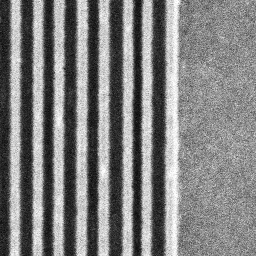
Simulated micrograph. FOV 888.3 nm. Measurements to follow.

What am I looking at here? parallel lines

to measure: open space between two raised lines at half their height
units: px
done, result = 11.6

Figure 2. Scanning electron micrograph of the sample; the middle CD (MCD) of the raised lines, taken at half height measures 37.3 nm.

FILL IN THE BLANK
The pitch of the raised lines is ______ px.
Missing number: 22.2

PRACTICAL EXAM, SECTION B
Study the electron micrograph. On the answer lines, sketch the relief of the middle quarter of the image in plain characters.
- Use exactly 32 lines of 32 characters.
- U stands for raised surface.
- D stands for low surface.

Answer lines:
DDDUUUDDDUUDDDDUUDDUUUDDDUUUDDDD
DDDUUUDDDUUDDDDUUDDUUUDDDUUUDDDD
DDDUUUDDDUUDDDDUUDDUUUDDDUUUDDDD
DDDUUUDDDUUDDDDUUDDDUUDDDUUUDDDD
DDDUUUDDDUUDDDDUUDDDUUDDDUUUDDDD
DDDUUUDDDUUDDDDUUDDUUUDDDUUUDDDD
DDDUUUDDDUUDDDDUUDDUUUDDDUUUDDDD
DDDUUUDDDUUDDDDUUDDUUUDDDUUUDDDD
DDDUUUDDUUUDDDDUUDDUUUDDDUUUDDDD
DDDUUUDDDUUDDDDUUDDUUUDDDUUUDDDD
DDDUUUDDDUUDDDDUUDDUUUDDDUUUDDDD
DDDUUUDDDUUDDDDUUDDDUUDDDUUUDDDD
DDDUUUDDDUUDDDDUUDDUUUDDDUUUDDDD
DDDUUUDDDUUDDDDUUDDUUUDDDUUUDDDD
DDDUUUDDDUUDDDDUUDDUUUDDDUUUDDDD
DDDUUUDDDUUDDDDUUDDUUUDDDUUUDDDD
DDDUUUDDDUUDDDDUUDDUUUDDDUUUDDDD
DDDUUUDDUUUDDDDUUDDUUUDDDUUUDDDD
DDDUUUDDDUUDDDDUUDDUUUDDDUUUDDDD
DDDUUUDDDUUDDDDUUDDUUUDDDUUUDDDD
DDDUUUDDDUUDDDDUUDDUUUDDDUUUDDDD
DDDUUUDDUUUDDDDUUDDUUUDDDUUUDDDD
DDDUUUDDDUUDDDDUUDDDUUDDDUUUDDDD
DDDUUUDDDUUDDDDUUDDUUUDDDUUUDDDD
DDDUUUDDDUUDDDDUUDDUUUDDDUUUDDDD
DDDUUUDDDUUDDDDUUDDUUUDDDUUUDDDD
DDDUUUDDDUUDDDDUUDDUUUDDDUUUDDDD
DDDUUUDDDUUDDDDUUDDUUUDDDUUUDDDD
DDDUUUDDDUUDDDDUUDDUUUDDDUUUDDDD
DDDUUUDDDUUDDDDUUDDUUUDDDUUUDDDD
DDDUUUDDDUUDDDDUUDDUUUDDDUUUDDDD
DDDUUUDDDUUDDDDUUDDUUUDDDUUUDDDD